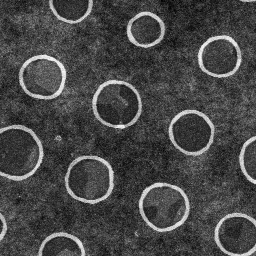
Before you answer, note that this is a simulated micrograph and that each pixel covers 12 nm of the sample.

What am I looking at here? raised bodies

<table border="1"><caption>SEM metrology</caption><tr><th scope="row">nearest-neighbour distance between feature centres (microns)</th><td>0.947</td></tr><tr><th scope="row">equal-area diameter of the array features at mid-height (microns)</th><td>0.508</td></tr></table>